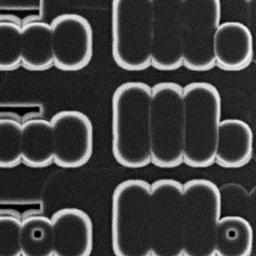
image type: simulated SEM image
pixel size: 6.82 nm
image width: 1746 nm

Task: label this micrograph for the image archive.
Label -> wiring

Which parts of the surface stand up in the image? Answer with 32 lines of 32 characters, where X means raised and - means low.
--------------XXXXXXXXXXXXX-----
--------------XXXXXXXXXXXXX-----
-------XXX----XXXXXXXXXXXXX-----
XX-XXXXXXXX---XXXXXXXXXXXXXXXXX-
XXXXXXXXXXX---XXXXXXXXXXXXXXXXX-
XXXXXXXXXXX---XXXXXXXXXXXXXXXXX-
XXXXXXXXXXX---XXXXXXXXXXXXXXXXX-
XXXXXXXXXXX----XXXXXXXXXXXXXXXX-
--------X---------------XX------
--------------------------------
--------------------------------
---------------XXXXXXXXXXXX-----
--------------XXXXXXXXXXXXX-----
--------------XXXXXXXXXXXXX-----
-------XXX----XXXXXXXXXXXXX-----
XX-XXXXXXXX---XXXXXXXXXXXXXXXX--
XXXXXXXXXXX---XXXXXXXXXXXXXXXXX-
XXXXXXXXXXX---XXXXXXXXXXXXXXXXX-
XXXXXXXXXXX---XXXXXXXXXXXXXXXXX-
XXXXXXXXXXX----XXXXXXXXXXXXXXXX-
--------XX------XX--XX--XX------
--------------------------------
--------------------------------
---------------XXXXXXXXXXXX-----
--------------XXXXXXXXXXXXX-----
--------------XXXXXXXXXXXXX-----
--------XX----XXXXXXXXXXXXX-----
XX-XXXXXXXX---XXXXXXXXXXXXXXXX--
XXXXXXXXXXX---XXXXXXXXXXXXXXXXX-
XXXXXXXXXXX---XXXXXXXXXXXXXXXXX-
XXXXXXXXXXX---XXXXXXXXXXXXXXXXX-
XXXXXXXXXXX----XXXXXXXXXXXXXXXX-